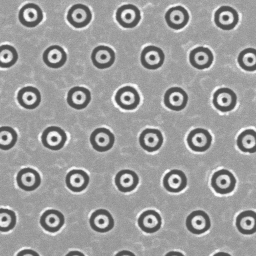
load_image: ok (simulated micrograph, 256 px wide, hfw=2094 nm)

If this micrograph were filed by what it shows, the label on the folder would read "a regular array of ring-shaped grooves with a dot in the middle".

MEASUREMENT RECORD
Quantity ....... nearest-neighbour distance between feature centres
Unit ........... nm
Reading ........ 385